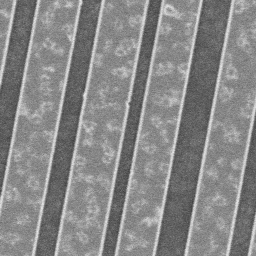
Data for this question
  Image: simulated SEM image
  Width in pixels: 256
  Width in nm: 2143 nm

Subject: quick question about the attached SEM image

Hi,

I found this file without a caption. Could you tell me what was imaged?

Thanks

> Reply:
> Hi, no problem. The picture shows parallel lines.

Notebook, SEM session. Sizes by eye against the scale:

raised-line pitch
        0.521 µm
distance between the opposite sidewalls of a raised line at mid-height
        342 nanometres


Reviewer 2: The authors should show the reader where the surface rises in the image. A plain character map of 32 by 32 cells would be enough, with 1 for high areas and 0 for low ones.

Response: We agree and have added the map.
11000111110001111100111110000111
11000111110001111100111110000111
10001111110011111100111110000111
10001111100011111100111100001111
10001111100011111100111100001111
10001111100011111001111100001111
10001111100011111001111100001111
00011111100011111001111100001111
00011111000111111001111100001111
00011111000111111001111000011111
00011111000111110011111000011111
00011111000111110011111000011111
00011111000111110011111000011111
00111111001111110011111000011111
00111110001111110011110000111111
00111110001111110011110000111110
00111110001111100111110000111110
00111110001111100111110000111110
01111110011111100111110000111110
01111100011111100111110000111110
01111100011111100111100001111110
01111100011111001111100001111100
01111100011111001111100001111100
11111100011111001111100001111100
11111000111111001111100001111100
11111000111111001111000011111100
11111000111110001111000011111000
11111000111110011111000011111000
11111000111110011111000011111000
11111001111110011111000011111000
11110001111110011111000111111001
11110001111110011110000111110001